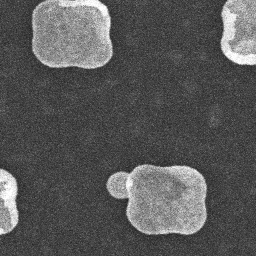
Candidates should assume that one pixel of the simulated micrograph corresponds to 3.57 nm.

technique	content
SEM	raised bodies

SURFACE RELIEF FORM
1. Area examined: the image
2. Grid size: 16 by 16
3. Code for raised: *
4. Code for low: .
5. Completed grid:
..*****.......**
..*****.......**
..*****.......**
..*****.......**
................
................
................
................
................
................
.........***....
*.......*****...
*.......*****...
*.......*****...
.........***....
................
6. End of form